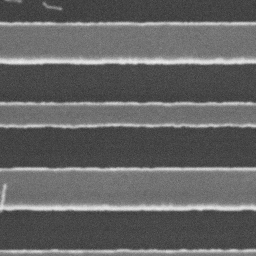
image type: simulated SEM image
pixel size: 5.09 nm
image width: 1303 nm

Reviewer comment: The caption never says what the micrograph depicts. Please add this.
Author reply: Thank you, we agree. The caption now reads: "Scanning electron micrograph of lines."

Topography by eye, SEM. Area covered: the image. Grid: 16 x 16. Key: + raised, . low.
................
++++++++++++++++
++++++++++++++++
++++++++++++++++
................
................
++++++++++++++++
++++++++++++++++
................
................
................
++++++++++++++++
++++++++++++++++
................
................
................